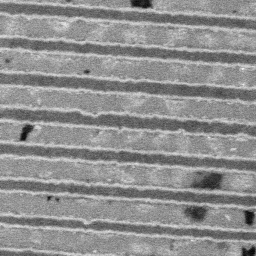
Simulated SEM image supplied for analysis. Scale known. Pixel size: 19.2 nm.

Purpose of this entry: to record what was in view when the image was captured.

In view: parallel lines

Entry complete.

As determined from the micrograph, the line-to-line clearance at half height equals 0.409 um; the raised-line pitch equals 677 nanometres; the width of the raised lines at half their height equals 13.6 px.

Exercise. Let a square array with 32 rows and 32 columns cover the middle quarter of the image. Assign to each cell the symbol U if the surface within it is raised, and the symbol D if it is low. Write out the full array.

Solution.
DDDDDDDDDDDDDDDDDDDDDDDDDDDDDDDD
DDDDDDDDDDDDDDDDDDDDDDDDDDDDDDDD
DDDDDDDDDDDDDDDDDDDDDDDDDDDDDDDD
UUUUUUUUDDDDDDDDDDDDDDDDDDDDDDDD
UUUUUUUUUUUUUUUUUUUUUUUDUDDDDDDD
UUUUUUUUUUUUUUUUUUUUUUUUUUUUUUUU
DUUDDUUUUUUUUUUUUUUUUUUUUUUUUUUU
DDDDDDDDDDDDDDDDDDDUUUUUUUUUUUUU
DDDDDDDDDDDDDDDDDDDDDDDDDDDDDDUD
DDDDDDDDDDDDDDDDDDDDDDDDDDDDDDDD
DDDDDDDDDDDDDDDDDDDDDDDDDDDDDDDD
DDUDDDDDDDDDDDDDDDDDDDDDDDDDDDDD
UUUUUUUDDUUUUUUUDDDDDDDDDDDDDDDD
UUUUUUUUUUUUUUUUUUUUUUUUUUUUDDDD
UUUUUUUUUUUUUUUUUUUUUUUUUUUUUUUU
DUDDUUUUUUUUUUUUUUUUUUUUUUUUUUUU
DDDDDDDDDDDDDUDDDDUUUUUUUUUUUUUU
DDDDDDDDDDDDDDDDDDDDDDDDDDDDDDDD
DDDDDDDDDDDDDDDDDDDDDDDDDDDDDDDD
DDDDDDDDDDDDDDDDDDDDDDDDDDDDDDDD
DDDDDDDDDDDDDDDDDDDDDDDDDDDDDDDD
UUUUUUUUUUUUUDUDDDDDDDDDDDDDDDDD
UUUUUUUUUUUUUUUUUUUUUUUUUUUUUDDD
UUUUUUUUUUUUUUUUUUUUUUUUUUUUUUUU
DDDDDDDUUUUUUUUUUUUUUUUUUUUUUUUU
DDDDDDDDDDDDDDDDDDDDDDDUUUUUUUUU
DDDDDDDDDDDDDDDDDDDDDDDDDDDDDDDD
DDDDDDDDDDDDDDDDDDDDDDDDDDDDDDDD
DDDDDDDDDDDDDDDDDDDDDDDDDDDDDDDD
UUUDDDDDDDDDDDDDDDDDDDDDDDDDDDDD
UUUUUUUUUUUUUUDDDDDDDDDDDDDDDDDD
UUUUUUUUUUUUUUUUUUUUUUUUUUUUUDUU